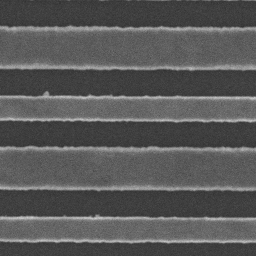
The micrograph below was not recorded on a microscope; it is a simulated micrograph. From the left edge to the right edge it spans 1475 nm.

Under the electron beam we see lines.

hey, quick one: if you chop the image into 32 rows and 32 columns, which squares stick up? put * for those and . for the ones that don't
................................
................................
................................
***************.***********.****
********************************
********************************
********************************
********************************
********************************
................................
................................
................................
********************************
********************************
********************************
................................
................................
................................
*****************************.*.
********************************
********************************
********************************
********************************
********************************
................................
................................
................................
********************************
********************************
********************************
................................
................................